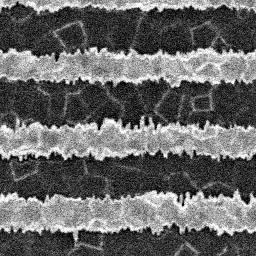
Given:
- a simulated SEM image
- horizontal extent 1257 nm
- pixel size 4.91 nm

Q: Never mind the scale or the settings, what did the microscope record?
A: one or a few lines or trenches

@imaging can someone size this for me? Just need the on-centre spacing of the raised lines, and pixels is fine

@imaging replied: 73.4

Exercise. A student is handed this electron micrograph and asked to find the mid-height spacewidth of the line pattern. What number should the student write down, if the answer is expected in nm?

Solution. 219